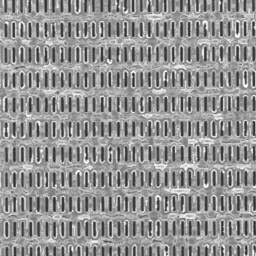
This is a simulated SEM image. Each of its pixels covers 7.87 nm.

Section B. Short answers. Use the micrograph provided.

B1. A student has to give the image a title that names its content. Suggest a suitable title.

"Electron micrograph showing a regular array of holes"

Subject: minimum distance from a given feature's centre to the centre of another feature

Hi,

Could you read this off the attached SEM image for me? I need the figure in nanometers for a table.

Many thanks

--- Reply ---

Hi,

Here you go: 59.6